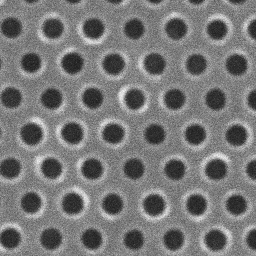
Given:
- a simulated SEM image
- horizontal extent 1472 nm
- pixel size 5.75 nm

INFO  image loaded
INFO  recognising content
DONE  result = a regular array of holes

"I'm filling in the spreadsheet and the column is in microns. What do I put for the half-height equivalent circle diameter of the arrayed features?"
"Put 0.131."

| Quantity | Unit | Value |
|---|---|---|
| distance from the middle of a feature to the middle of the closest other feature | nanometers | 231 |